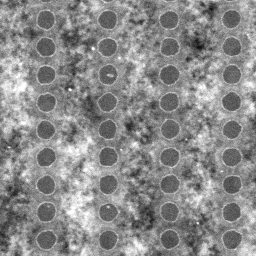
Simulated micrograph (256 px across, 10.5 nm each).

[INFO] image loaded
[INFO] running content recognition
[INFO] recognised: a regular array of raised bodies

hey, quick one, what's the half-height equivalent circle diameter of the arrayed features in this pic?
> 19.8 pixels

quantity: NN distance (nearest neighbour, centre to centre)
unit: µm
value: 0.287